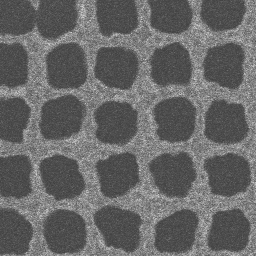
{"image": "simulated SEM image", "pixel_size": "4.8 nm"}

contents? a regular array of holes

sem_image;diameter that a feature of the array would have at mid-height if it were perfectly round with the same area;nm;215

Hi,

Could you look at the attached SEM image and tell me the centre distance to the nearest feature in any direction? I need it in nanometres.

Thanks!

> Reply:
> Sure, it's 250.